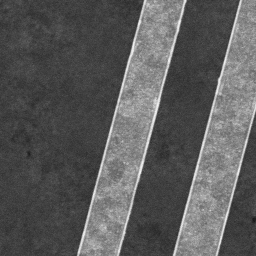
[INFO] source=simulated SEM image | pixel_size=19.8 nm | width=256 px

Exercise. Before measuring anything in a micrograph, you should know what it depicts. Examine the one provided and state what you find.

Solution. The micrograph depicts one or a few lines or trenches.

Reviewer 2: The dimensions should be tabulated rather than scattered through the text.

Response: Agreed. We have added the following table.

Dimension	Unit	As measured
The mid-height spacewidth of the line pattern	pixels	54.1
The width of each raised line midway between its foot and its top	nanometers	762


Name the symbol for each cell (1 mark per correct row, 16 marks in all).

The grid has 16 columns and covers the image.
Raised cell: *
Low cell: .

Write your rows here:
.........**....*
.........**....*
........***...**
........***...**
........**....**
........**....**
.......***...***
.......***...***
.......**....**.
.......**....**.
......***...***.
......***...***.
......**....**..
......**....**..
.....***...***..
.....**....***..